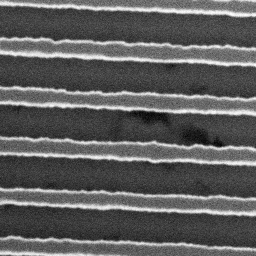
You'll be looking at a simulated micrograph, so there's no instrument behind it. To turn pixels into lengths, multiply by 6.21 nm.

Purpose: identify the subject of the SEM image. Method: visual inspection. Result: lines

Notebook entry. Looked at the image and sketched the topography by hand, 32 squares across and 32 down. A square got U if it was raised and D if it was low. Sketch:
UUUUUUUUUUUUUUUUUUUUUUUUUUUUUUUU
DDDDDDDDDDDDDDDDDDDDDDUUUUUUUUUU
DDDDDDDDDDDDDDDDDDDDDDDDDDDDDDDD
DDDDDDDDDDDDDDDDDDDDDDDDDDDDDDDD
DDDDDDDDDDDDDDDDDDDDDDDDDDDDDDDD
UUUUUUUUUUUUUUUUDUDDDDDDDDDDDDDD
UUUUUUUUUUUUUUUUUUUUUUUUUUUUUUUU
DDDDDDDDDDDDDDDDDUUUUUUUUUUUUUUU
DDDDDDDDDDDDDDDDDDDDDDDDDDDDDDDD
DDDDDDDDDDDDDDDDDDDDDDDDDDDDDDDD
DDDDDDDDDDDDDDDDDDDDDDDDDDDDDDDD
UUUUUUUUUUDUUDDUDDDDDDDDDDDDDDDD
UUUUUUUUUUUUUUUUUUUUUUUUUUUUUUUU
DDDDDDDDDDDDUUUUUUUUUUUUUUUUUUUU
DDDDDDDDDDDDDDDDDDDDDDDDDDDDDDDD
DDDDDDDDDDDDDDDDDDDDDDDDDDDDDDDD
DDDDDDDDDDDDDDDDDDDDDDDDDDDDDDDD
UUUUUUUUUDDDDDDDDDDDDDDDDDDDDDDD
UUUUUUUUUUUUUUUUUUUUUUUUUUUUUUUU
DDDDDUUUUUUUUUUUUUUUUUUUUUUUUUUU
DDDDDDDDDDDDDDDDDDDDDDDDDDDDUUUU
DDDDDDDDDDDDDDDDDDDDDDDDDDDDDDDD
DDDDDDDDDDDDDDDDDDDDDDDDDDDDDDDD
DDDDDDDDDDDDDDDDDDDDDDDDDDDDDDDD
UUUUUUUUUUUUUUUUUUUUUUUUDDDDDDDD
DUUUUUUUUUUUUUUUUUUUUUUUUUUUUUUU
DDDDDDDDDDDDDDDDDDDDDDUUUUUUUUUU
DDDDDDDDDDDDDDDDDDDDDDDDDDDDDDDD
DDDDDDDDDDDDDDDDDDDDDDDDDDDDDDDD
DDDDDDDDDDDDDDDDDDDDDDDDDDDDDDDD
UUUUUUUUUUUUUUUUUUUUUUUDDDDDDDDD
UUUUUUUUUUUUUUUUUUUUUUUUUUUUUUUU